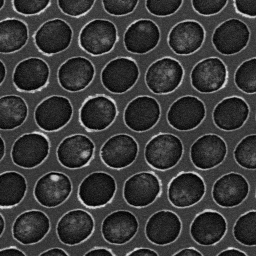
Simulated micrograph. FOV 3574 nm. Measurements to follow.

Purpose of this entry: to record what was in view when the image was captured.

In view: a regular array of holes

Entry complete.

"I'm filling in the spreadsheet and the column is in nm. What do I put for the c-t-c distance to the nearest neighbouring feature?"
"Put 611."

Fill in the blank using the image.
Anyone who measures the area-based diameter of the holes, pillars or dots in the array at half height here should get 492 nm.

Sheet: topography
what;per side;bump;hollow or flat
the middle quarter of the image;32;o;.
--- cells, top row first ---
.......oooo.......oooo.......ooo
........oo.........oo.........oo
........o..........o..........oo
.......oo.........oo.........ooo
.......ooo........oo.........ooo
......oooo.......oooo........ooo
o...ooooooo.....oooooo......oooo
oooooooooooooooooooooooooooooooo
ooooooo....ooooooo....ooooooo...
.ooooo......ooooo......ooooo....
..ooo........ooo........ooo.....
..oo.........oo.........oo......
..oo.........oo.........oo......
..oo.........oo.........oo......
.oooo.......ooo........ooo......
ooooo......ooooo.......oooo.....
ooooooo..oooooooo...oooooooo....
oooooooooooooo.ooooooooo...ooooo
......oooooo.....ooooo......oooo
.......ooo........ooo........ooo
........oo........ooo.........oo
.......oo.........oo..........oo
.......oo.........oo..........oo
.......oo.........oo.........ooo
......oooo.......oooo.......oooo
.....oooooo.....oooooo......oooo
oooooooooooooooooooooooooooooooo
ooooooo....ooooooo....ooooooo...
.oooo.......ooooo......ooooo....
..oo.........oo.........ooo.....
..oo.........oo.........oo......
..oo.........oo.........oo......